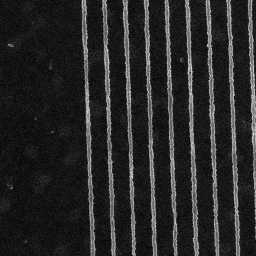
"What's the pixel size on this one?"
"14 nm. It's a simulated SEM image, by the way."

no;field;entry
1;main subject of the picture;parallel lines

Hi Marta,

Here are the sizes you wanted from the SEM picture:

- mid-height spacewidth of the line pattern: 0.242 microns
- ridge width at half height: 0.0473 micrometres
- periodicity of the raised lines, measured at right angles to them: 291 nanometres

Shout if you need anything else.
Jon